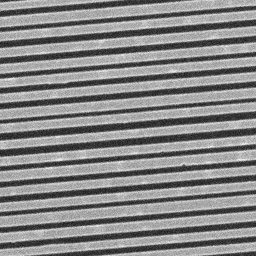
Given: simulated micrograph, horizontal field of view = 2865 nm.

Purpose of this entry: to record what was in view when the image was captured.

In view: parallel lines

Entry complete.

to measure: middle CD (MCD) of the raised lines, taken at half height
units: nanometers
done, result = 97.5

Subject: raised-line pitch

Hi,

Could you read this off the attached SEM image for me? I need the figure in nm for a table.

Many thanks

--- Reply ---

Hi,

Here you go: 172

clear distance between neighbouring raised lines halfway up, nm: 75.2